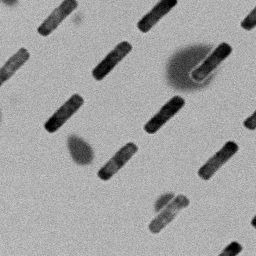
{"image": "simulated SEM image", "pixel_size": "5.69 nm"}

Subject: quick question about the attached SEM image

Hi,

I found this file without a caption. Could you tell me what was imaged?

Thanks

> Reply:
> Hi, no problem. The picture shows holes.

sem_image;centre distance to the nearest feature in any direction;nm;400